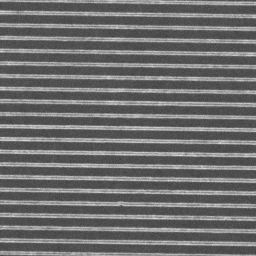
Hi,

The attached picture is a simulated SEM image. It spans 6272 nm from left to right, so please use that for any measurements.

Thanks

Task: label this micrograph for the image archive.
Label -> parallel lines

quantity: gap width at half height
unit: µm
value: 0.239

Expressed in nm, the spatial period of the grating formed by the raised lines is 310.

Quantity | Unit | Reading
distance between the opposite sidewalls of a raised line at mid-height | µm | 0.0735